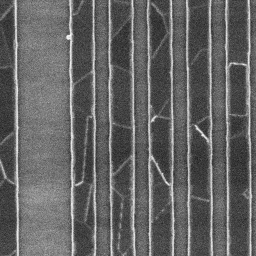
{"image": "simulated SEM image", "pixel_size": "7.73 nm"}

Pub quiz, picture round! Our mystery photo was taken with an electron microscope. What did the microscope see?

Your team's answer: wiring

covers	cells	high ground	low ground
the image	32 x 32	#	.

##.......###..###..##..###..###.
##.......###..###.###..###..###.
##.......###..###.###..###..###.
##.......###..###..##..###..###.
##.......###..###..##..###..###.
##.......###..###..##..###..###.
##.......###..###..##..###..###.
##.......###..###..##..###..###.
##.......###..###..##..###..###.
##.......###..###..##...##..###.
##.......###..###..##...##..###.
##.......###..###..##...##..###.
##.......###..###..##...##..###.
##.......###..###..##...##..###.
##.......###..###..###..##..###.
##.......###..###..###..##..###.
##.......###..###..###..##..###.
##.......###..###..###..##..###.
##.......###..###..###..##..###.
##.......###..###..###..##..###.
##.......###..###..###..##..###.
##.......###..###..###..##..###.
##.......###..###..###..##..###.
##.......###..###..##...##..###.
##.......###..###..###..##..###.
##.......###..###..###..##..###.
##.......###..###..###..##..###.
##.......###..###..###..##..###.
##.......###..###..###..##..###.
##.......###..###..###..##..###.
##.......###..###..###..##..###.
##.......###..###..###..###.###.